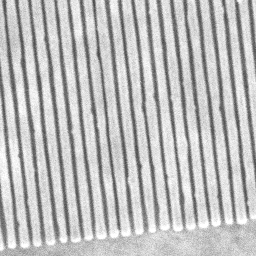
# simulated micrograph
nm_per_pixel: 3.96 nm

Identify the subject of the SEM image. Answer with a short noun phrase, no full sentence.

parallel lines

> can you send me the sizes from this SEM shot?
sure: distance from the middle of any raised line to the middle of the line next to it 50.8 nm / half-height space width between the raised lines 17.2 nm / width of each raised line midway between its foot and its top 34.4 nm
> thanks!